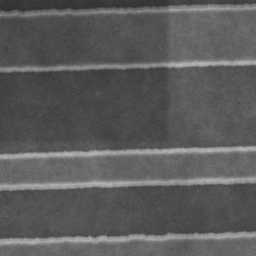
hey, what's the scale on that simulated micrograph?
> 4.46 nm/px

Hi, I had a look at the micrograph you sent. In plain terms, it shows lines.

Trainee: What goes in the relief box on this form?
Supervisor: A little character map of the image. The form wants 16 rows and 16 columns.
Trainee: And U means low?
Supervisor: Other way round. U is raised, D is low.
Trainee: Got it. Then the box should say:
DDDDDDDDDDDDUUUU
UUUUUUUUUUUUUUUU
UUUUUUUUUUUUUUUU
UUUUUUUUUUUUUUUU
DDDDDDDDDDDDDDDD
DDDDDDDDDDDDDDDD
DDDDDDDDDDDDDDDD
DDDDDDDDDDDDDDDD
DDDDDDDDDDDDDDDD
DDDDDDDDDUUUUUUU
UUUUUUUUUUUUUUUU
UUUUUUUDDDDDDDDD
DDDDDDDDDDDDDDDD
DDDDDDDDDDDDDDDD
DDDDDDDDDDDDDDDD
UUUUUUUUUUUUUUUU